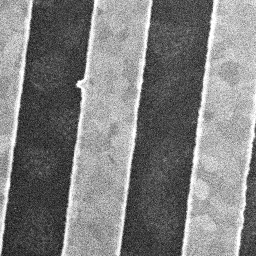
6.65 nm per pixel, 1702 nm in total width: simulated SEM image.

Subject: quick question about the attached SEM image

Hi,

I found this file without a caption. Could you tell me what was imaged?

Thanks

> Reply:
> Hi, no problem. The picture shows one or a few lines or trenches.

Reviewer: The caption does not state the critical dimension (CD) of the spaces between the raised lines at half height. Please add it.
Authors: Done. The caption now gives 0.42 microns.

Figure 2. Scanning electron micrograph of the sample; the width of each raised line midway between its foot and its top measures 365 nm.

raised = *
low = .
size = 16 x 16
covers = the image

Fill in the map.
**....***....***
**....***....***
**....***....***
**....***....***
*....****....***
*....****....***
*....****....***
*....***....****
*....***....****
*....***....****
*....***....***.
*...****....***.
....****....***.
....****....***.
....****....***.
....***....****.